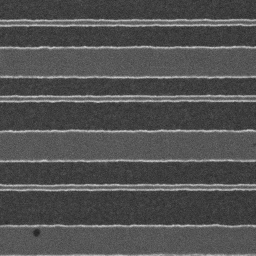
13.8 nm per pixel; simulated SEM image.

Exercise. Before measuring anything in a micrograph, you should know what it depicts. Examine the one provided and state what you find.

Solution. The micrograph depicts lines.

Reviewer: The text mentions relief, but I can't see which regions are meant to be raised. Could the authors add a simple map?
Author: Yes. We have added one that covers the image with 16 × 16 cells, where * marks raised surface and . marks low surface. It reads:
................
................
................
****************
****************
................
................
................
****************
****************
................
................
................
................
****************
****************